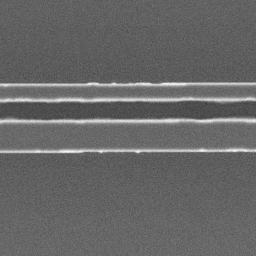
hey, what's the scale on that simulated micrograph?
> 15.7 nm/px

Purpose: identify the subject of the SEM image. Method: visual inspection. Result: lines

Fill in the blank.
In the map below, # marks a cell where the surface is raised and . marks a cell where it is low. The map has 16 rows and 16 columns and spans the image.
................
................
................
................
................
################
################
################
################
................
................
................
................
................
................
................